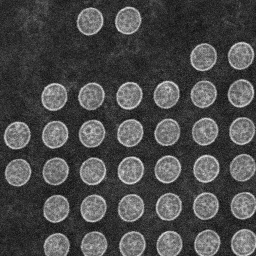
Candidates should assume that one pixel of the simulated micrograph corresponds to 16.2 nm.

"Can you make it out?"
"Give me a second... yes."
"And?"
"a regular array of raised bodies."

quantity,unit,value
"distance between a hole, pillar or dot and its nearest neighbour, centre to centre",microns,0.601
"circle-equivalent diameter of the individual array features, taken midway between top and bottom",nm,414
